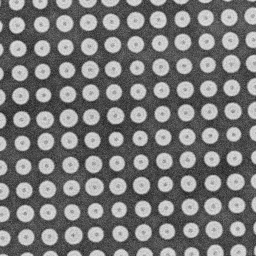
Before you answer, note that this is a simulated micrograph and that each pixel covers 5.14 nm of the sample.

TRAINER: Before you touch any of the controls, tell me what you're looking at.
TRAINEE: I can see an array of small figures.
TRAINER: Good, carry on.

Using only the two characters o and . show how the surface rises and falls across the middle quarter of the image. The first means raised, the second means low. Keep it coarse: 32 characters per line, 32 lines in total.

oo...ooo..oooo...ooo..oooo..oooo
ooo..oooo.oooo...ooo..oooo..oooo
oo...ooo...ooo...oo....ooo......
......o.........................
................................
......oo....oo...ooo...ooo...ooo
ooo..oooo..ooo...ooo...ooo..oooo
ooo..oooo..ooo...ooo...ooo...ooo
ooo..ooo...ooo...ooo............
o...............................
.............................ooo
oo....oo...ooo...ooo...ooo...ooo
ooo..oooo..oooo..oooo..ooo...ooo
ooo..oooo..oooo..ooo...ooo...ooo
ooo..ooo....oo....oo............
oo..............................
........................o.....oo
ooo...oo....oo....ooo..oooo..ooo
ooo..oooo..oooo..oooo..oooo..ooo
ooo..oooo..oooo..oooo..ooo...ooo
ooo...oo....o...................
................................
........................oo....oo
.oo...ooo...ooo...ooo..oooo..ooo
ooo..oooo..oooo...ooo..oooo..ooo
oooo.oooo..oooo...ooo...ooo...oo
ooo...ooo...oo..................
................................
...................o....oo....oo
.oo...ooo...ooo...ooo...ooo..ooo
oooo.ooooo.ooooo.oooo...ooo..ooo
oooo..oooo..ooo...ooo...ooo...oo